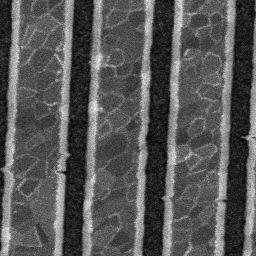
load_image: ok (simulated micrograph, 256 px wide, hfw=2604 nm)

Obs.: one or a few lines or trenches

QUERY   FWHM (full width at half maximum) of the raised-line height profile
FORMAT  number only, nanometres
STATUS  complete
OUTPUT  538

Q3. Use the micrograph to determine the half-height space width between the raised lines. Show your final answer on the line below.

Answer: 288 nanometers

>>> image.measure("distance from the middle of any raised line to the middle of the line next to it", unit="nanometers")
821